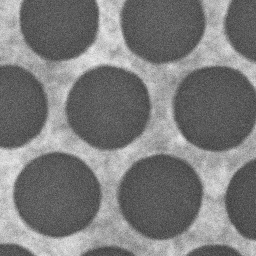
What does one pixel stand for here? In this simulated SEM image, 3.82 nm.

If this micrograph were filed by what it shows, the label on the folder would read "holes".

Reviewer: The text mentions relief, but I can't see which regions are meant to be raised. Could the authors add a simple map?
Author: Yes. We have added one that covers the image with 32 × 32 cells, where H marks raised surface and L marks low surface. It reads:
HHHLLLLLLLLLHHHLLLLLLLLLLHHHHLLL
HHLLLLLLLLLLHHHLLLLLLLLLLLHHLLLL
HHLLLLLLLLLLHHHLLLLLLLLLLLHHLLLL
HHHLLLLLLLLLHHHLLLLLLLLLLLHHLLLL
HHHLLLLLLLLLHHHLLLLLLLLLLHHHLLLL
HHHLLLLLLLLLHHHHLLLLLLLLLHHHHLLL
HHHHLLLLLLLHHHHHHLLLLLLLHHHHHHLL
HHHHHHLLHHHHHHHHHHLLLLLHHHHHHHHL
LLLHHHHHHHHLLLLLHHHHHHHHHLLLLHHH
LLLLHHHHHHLLLLLLLHHHHHHLLLLLLLLH
LLLLLHHHHLLLLLLLLLHHHHLLLLLLLLLL
LLLLLLHHHLLLLLLLLLLHHHLLLLLLLLLL
LLLLLLHHLLLLLLLLLLLHHHLLLLLLLLLL
LLLLLLHHLLLLLLLLLLLHHHLLLLLLLLLL
LLLLLLHHLLLLLLLLLLLHHHLLLLLLLLLL
LLLLLLHHHLLLLLLLLLHHHHLLLLLLLLLL
LLLLLHHHHLLLLLLLLLHHHHHLLLLLLLLH
LLLLHHHHHHLLLLLLLHHHHHHLLLLLLLLH
LLHHHHHHHHHHLLLHHHHHHHHHHLLLLHHH
HHHHHLLLLHHHHHHHHHHLLLHHHHHHHHHH
HHHLLLLLLLLHHHHHHLLLLLLLHHHHHHHL
HHHLLLLLLLLLHHHHLLLLLLLLLHHHHHLL
HHLLLLLLLLLLHHHLLLLLLLLLLHHHHLLL
HHLLLLLLLLLLLHHLLLLLLLLLLHHHLLLL
HHLLLLLLLLLLLHHLLLLLLLLLLHHHLLLL
HHLLLLLLLLLLLHHLLLLLLLLLLHHHLLLL
HHLLLLLLLLLLHHHLLLLLLLLLLHHHLLLL
HHHLLLLLLLLLHHHHLLLLLLLLHHHHHLLL
HHHHLLLLLLLHHHHHLLLLLLLLHHHHHLLL
HHHHHHLLHHHHHHHHHHLLLLHHHHHHHHLL
LLHHHHHHHHHHHHHHHHHHHHHHHHHHHHHH
LLLLHHHHHHHLLLLLHHHHHHHHLLLLLLHH